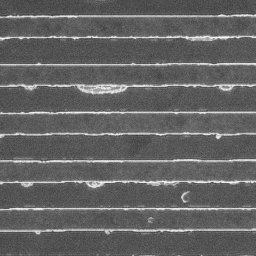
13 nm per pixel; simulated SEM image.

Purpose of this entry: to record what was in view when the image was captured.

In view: lines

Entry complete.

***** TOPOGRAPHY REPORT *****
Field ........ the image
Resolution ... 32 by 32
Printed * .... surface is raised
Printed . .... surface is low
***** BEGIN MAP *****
................................
................................
********************************
********************************
********************************
................................
................................
................................
********************************
********************************
********************************
................................
................................
................................
********************************
********************************
********************************
................................
................................
................................
********************************
********************************
********************************
................................
................................
................................
********************************
********************************
********************************
................................
................................
................................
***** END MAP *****